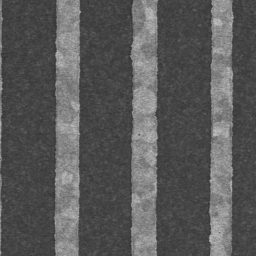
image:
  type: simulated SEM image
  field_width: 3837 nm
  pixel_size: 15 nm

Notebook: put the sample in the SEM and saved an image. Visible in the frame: one or a few lines or trenches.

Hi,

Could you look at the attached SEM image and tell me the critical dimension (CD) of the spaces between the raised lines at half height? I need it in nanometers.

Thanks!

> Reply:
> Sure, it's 813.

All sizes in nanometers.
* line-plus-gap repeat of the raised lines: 1150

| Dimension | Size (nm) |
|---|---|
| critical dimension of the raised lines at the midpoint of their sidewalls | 324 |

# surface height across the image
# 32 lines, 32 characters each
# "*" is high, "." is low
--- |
.......***.......***.......**...
.......***.......***......***...
.......***.......***......***...
.......***.......***......***...
.......***.......***.......**...
.......***.......***......***...
.......***......****......***...
.......***......****.......**...
.......***.......***......***...
.......***.......***......***...
.......***.......***......***...
.......***.......***......***...
.......***.......***......***...
.......***.......***......***...
.......***.......**.......***...
.......***.......***......***...
.......***.......***......***...
.......***.......***......***...
.......***......****......***...
.......***.......***......***...
.......***......****......***...
.......***.......***......***...
.......***......****......***...
.......***......****......***...
.......***.......**.......***...
.......***.......**.......***...
.......***.......**.......***...
.......***.......**.......***...
.......***......***.......***...
.......***......***.......***...
.......***......****......***...
.......***......****......***...